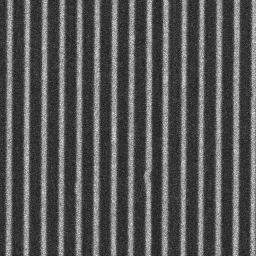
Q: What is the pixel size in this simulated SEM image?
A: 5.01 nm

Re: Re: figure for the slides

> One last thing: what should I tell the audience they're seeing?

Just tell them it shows parallel lines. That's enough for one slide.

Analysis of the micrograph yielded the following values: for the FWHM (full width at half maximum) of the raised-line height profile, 33.8 nm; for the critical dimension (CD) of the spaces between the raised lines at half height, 55.1 nanometres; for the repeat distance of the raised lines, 87.5 nm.